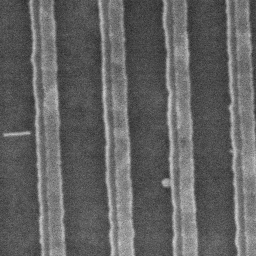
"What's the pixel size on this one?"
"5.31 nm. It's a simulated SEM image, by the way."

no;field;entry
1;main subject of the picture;lines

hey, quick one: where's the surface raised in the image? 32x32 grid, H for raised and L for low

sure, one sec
LLLLHHLLLLLLHHHLLLLLLHHLLLLLHHHL
LLLLHHHLLLLLLHHLLLLLLHHLLLLLHHHL
LLLLHHHLLLLLLHHLLLLLLHHLLLLLLHHL
LLLLHHHLLLLLLHHLLLLLLHHLLLLLLHHL
LLLLHHHLLLLLLHHLLLLLLHHLLLLLLHHL
LLLLHHHLLLLLLHHLLLLLLHHLLLLLLHHL
LLLLHHHLLLLLLHHHLLLLLHHLLLLLLHHL
LLLLHHHLLLLLLHHHLLLLLHHLLLLLLHHL
LLLLHHHLLLLLLHHHLLLLLHHLLLLLLHHL
LLLLHHHLLLLLLHHHLLLLLHHHLLLLLHHL
LLLLHHHLLLLLLHHHLLLLLHHHLLLLLHHL
LLLLHHHLLLLLLHHHLLLLLHHHLLLLLHHH
LLLLHHHLLLLLLHHHLLLLLHHHLLLLLHHH
LLLLLHHLLLLLLHHHLLLLLHHHLLLLLHHH
LLLLLHHLLLLLLHHHLLLLLHHHLLLLLHHH
LLLLHHHLLLLLLHHHLLLLLHHHLLLLLHHH
LLLLLHHLLLLLLHHHLLLLLHHHLLLLLHHH
LLLLLHHLLLLLLHHHLLLLLHHHLLLLLHHH
LLLLLHHLLLLLLHHHLLLLLHHHLLLLLHHH
LLLLLHHLLLLLLHHHLLLLLHHHLLLLLHHH
LLLLLHHLLLLLLHHHLLLLLHHHLLLLLHHH
LLLLLHHHLLLLLHHHLLLLLHHHLLLLLHHH
LLLLLHHHLLLLLHHHLLLLLHHHLLLLLHHH
LLLLLHHHLLLLLLHHLLLLLHHHLLLLLHHH
LLLLLHHHLLLLLLHHLLLLLLHHLLLLLHHH
LLLLLHHHLLLLLLHHLLLLLLHHLLLLLHHH
LLLLLHHHLLLLLLHHLLLLLLHHLLLLLHHH
LLLLLHHHLLLLLLHHLLLLLLHHLLLLLHHH
LLLLLHHHLLLLLLHHHLLLLLHHLLLLLLHH
LLLLLHHHLLLLLLHHHLLLLLHHHLLLLLHH
LLLLLHHHLLLLLLHHHLLLLLHHHLLLLLHH
LLLLLHHHLLLLLLHHHLLLLLHHHLLLLLHH